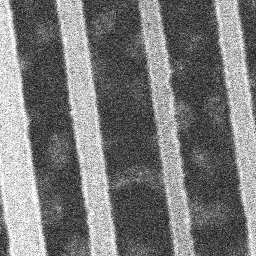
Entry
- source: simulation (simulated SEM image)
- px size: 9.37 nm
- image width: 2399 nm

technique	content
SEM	one or a few lines or trenches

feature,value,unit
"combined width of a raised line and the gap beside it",712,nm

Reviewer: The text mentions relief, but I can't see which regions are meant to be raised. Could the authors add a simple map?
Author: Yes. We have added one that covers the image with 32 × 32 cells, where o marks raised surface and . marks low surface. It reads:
.oooooo...oooooooo.oooooooo..ooo
.oooooo...oooooooo..ooooooo..ooo
.ooooooo..oooooooo..ooooooo...oo
.ooooooo..oooooooo..oooooooo..oo
..oooooo..oooooooo..oooooooo..oo
..oooooo...ooooooo..oooooooo..oo
..oooooo...oooooooo..ooooooo..oo
..oooooo...oooooooo..ooooooo..oo
..ooooooo..oooooooo..ooooooo..oo
..ooooooo..oooooooo..ooooooo...o
..ooooooo..oooooooo..oooooooo..o
..ooooooo...ooooooo..oooooooo..o
...oooooo...ooooooo..oooooooo..o
...oooooo...oooooooo.oooooooo..o
...oooooo...oooooooo.oooooooo..o
...oooooo...oooooooo..ooooooo..o
...ooooooo..oooooooo..ooooooo...
...ooooooo..oooooooo..oooooooo..
...ooooooo..oooooooo..oooooooo..
....oooooo...ooooooo..oooooooo..
....oooooo...oooooooo.oooooooo..
....oooooo...oooooooo.oooooooo..
....ooooooo..oooooooo..ooooooo..
....ooooooo..oooooooo..ooooooo..
o...ooooooo..oooooooo..ooooooo..
o...ooooooo..oooooooo..oooooooo.
o....oooooo...ooooooo..oooooooo.
o....oooooo...oooooooo.oooooooo.
o....oooooo...oooooooo.oooooooo.
o....ooooooo..oooooooo..ooooooo.
o....ooooooo..oooooooo..ooooooo.
oo...ooooooo..oooooooo..oooooooo